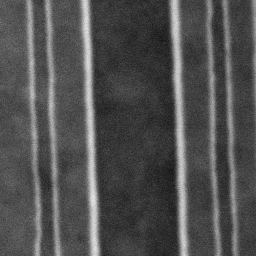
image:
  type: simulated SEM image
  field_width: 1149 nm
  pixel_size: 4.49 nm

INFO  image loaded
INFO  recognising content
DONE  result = lines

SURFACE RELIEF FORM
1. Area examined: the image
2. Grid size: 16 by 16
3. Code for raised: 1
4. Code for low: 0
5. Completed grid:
1111100000011111
1111100000011111
1111100000011111
1111100000011111
1111110000011111
1111110000011111
1111110000011111
1111110000011111
1111110000011111
1111110000011111
1111110000011111
1111110000011111
1111110000011111
1111110000011111
1111110000011111
1111110000011111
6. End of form